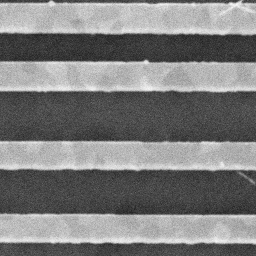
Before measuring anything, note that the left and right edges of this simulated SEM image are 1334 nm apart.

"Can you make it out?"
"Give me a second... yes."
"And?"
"lines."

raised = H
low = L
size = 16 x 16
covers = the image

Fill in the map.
HHHHHHHHHHHHHHHH
HHHHHHHHHHHHHHHH
LLLLLLLLLLLLLLLL
LLLLLLLLLLLLLLLL
HHHHHHHHHHHHHHHH
HHHHHHHHHHHHHHHH
LLLLLLLLLLLLLLLL
LLLLLLLLLLLLLLLL
LLLLLLLLLLLLLLLL
HHHHHHHHHHHHHHHH
HHHHHHHHHHHHHHHH
LLLLLLLLLLLLLLLL
LLLLLLLLLLLLLLLL
HHHHHHHHHHHHHHHH
HHHHHHHHHHHHHHHH
LLLLLLLLLLLLLLLL